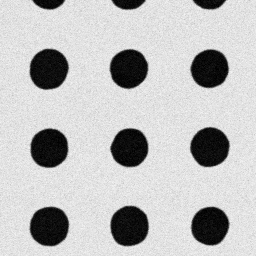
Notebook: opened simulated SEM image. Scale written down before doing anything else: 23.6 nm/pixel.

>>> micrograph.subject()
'a regular array of holes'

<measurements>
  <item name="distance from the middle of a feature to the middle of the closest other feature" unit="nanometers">1850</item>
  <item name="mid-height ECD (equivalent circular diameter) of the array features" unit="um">0.928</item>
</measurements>